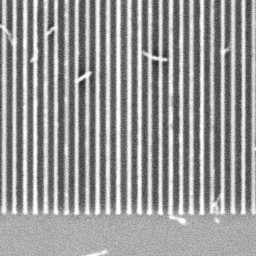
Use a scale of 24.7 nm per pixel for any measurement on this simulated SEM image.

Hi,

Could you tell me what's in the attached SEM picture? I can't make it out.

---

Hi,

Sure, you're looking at parallel lines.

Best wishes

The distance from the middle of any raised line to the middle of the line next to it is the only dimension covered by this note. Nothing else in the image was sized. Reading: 257 nanometers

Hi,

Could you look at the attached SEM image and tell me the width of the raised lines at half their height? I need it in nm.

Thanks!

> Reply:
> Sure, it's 43.2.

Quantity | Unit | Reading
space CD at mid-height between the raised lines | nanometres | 222